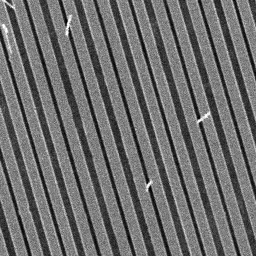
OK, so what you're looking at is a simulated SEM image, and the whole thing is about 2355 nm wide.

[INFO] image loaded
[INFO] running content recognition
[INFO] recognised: parallel lines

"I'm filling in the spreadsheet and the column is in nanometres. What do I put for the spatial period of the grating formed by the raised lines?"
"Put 154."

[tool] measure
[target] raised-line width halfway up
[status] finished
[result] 91.7 nm